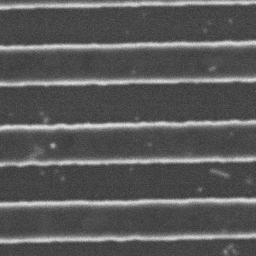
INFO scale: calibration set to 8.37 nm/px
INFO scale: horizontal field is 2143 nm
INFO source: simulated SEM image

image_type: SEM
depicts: lines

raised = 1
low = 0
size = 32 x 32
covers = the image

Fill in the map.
11111111111111111111111000000000
00000000000000000000000000000000
00000000000000000000000000000000
00000000000000000000000000000000
00000000000000000000000000000000
00000000000000000000111111111111
11111111111111111111111111111111
11111111111111111111111111111111
11111111111111111111111111111111
11111111111111111111111111111111
11111111100000000000000000000000
00000000000000000000000000000000
00000000000000000000000000000000
00000000000000000000000000000000
00000000000000000000000000000000
00000000000000011111111111111111
11111111111111111111111111111111
11111111111111111111111111111111
11111111111111111111111111111111
11111111111111111111111111111111
11111100000000000000000000000000
00000000000000000000000000000000
00000000000000000000000000000000
00000000000000000000000000000000
00000000000000000000000000000000
01111111111111111111111111111111
11111111111111111111111111111111
11111111111111111111111111111111
11111111111111111111111111111111
11111111111111111111111111111111
00000000000000000000000000000000
00000000000000000000000000000000